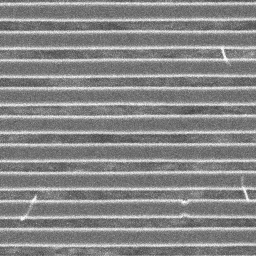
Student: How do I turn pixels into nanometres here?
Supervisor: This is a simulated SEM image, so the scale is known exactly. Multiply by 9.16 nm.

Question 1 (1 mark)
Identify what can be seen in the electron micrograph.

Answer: parallel lines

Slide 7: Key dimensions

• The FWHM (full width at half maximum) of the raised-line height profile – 0.157 um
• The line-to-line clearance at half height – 102 nanometres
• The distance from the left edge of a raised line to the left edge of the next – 258 nanometres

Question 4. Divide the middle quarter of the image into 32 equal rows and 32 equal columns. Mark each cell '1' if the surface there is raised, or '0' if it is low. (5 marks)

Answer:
11111111111111111111111111111111
11111111111111111111111111111111
11111111111111111111111111111111
00000000000000000000000000000000
00000000000000000000000000000000
00000000000000000000000000000000
11111111111111111111111111111111
11111111111111111111111111111111
11111111111111111111111111111111
11111111111111111111111111111111
00000000000000000000000000000000
00000000000000000000000000000000
00000000000000000000000000000000
11111111111111111111111111111111
11111111111111111111111111111111
11111111111111111111111111111111
11111111111111111111111111111111
00000000000000000000000000000000
00000000000000000000000000000000
00000000000000000000000000000000
11111111111111111111111111111111
11111111111111111111111111111111
11111111111111111111111111111111
11111111111111111111111111111111
00000000000000000000000000000000
00000000000000000000000000000000
00000000000000000000000000000000
11111111111111111111111111111111
11111111111111111111111111111111
11111111111111111111111111111111
11111111111111111111111111111111
00000000000000000000000000000000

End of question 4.